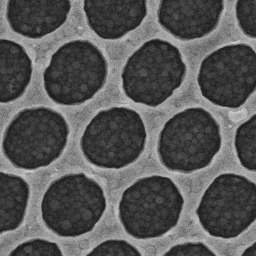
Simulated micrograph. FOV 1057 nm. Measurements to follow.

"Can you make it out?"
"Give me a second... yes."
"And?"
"holes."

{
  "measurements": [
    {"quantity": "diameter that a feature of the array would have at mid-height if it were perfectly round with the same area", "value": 260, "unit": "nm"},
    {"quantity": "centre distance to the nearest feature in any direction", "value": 315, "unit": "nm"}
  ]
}